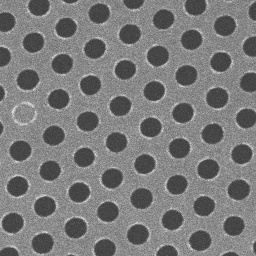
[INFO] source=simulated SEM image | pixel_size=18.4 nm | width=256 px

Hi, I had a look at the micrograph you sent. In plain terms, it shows a regular array of holes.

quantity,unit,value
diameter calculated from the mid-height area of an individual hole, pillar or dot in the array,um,0.395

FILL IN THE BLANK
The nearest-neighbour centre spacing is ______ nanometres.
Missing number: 649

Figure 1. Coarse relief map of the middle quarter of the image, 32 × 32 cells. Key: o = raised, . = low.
..ooooooooooo.....oooo..ooooo...
..oooooooooo......oooooooooo....
ooooooooooooo.....oooooooooo....
ooooo....ooooo...ooooooooooo....
oooo.....oooooooooooo...oooo....
oooo.....ooooooooooo.....ooooooo
oooo.....ooooooooooo.....ooooooo
.oooo...oooooooooooo.....ooooooo
.ooooooooooo....oooo....oooooooo
.ooooooooooo.....ooooooooooooooo
.oooooooooo......ooooooooooo....
ooooooooooo......oooooooooo.....
oooo....oooo....ooooooooooo.....
ooo......oooooooooooo..oooo.....
ooo......oooooooooo.....oooo...o
ooo.....ooooooooooo.....oooooooo
oooo...oooooooooooo.....oooooooo
oooooooooooo...ooooo....oooooooo
ooooooooooo.....ooooo.oooooooooo
oooooooooo......ooooooooooo....o
ooooooooooo.....oooooooooo......
ooo....oooo....ooooooooooo......
ooo.....oooooooooooo.ooooo.....o
oo......oooooooooo....oooooo..oo
ooo....ooooooooooo.....ooooooooo
oooo..ooooooooooo......ooooooooo
ooooooooooo...oooo....oooooooooo
oooooooooo.....ooooo.ooooooooooo
ooooooooo......ooooooooooo....oo
ooo.ooooo......ooooooooooo.....o
oo....oooo....oooooooooooo.....o
o.....oooooooooooo...ooooo....oo